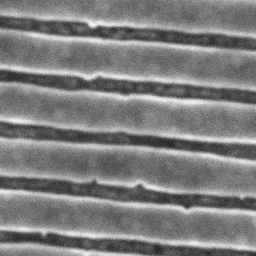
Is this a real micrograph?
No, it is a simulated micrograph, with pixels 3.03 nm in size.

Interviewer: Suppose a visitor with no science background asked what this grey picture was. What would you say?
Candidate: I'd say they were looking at parallel lines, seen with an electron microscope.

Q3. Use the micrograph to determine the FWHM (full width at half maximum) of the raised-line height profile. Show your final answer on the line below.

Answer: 0.116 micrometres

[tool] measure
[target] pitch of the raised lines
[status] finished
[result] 161 nm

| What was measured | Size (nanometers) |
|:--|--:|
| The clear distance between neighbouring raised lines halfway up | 43.4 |